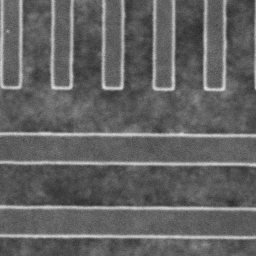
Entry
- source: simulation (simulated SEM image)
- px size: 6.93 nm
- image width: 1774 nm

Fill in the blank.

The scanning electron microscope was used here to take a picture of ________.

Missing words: groups of lines, slits or small figures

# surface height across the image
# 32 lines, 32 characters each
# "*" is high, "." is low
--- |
***....**....**....***....**....
***....**....**....***....**....
***....**....**....***....**....
***....**....**....***....**....
***....**....**....***....**....
***....**....**....***....**....
***....**....**....***....**....
***....**....**....***....**....
***....**....**....***....**....
***....**....**....***....**....
***....**....**....***....**....
................................
................................
................................
................................
................................
................................
********************************
********************************
********************************
.....................***********
................................
................................
................................
................................
................................
********************************
********************************
********************************
..............******************
................................
................................